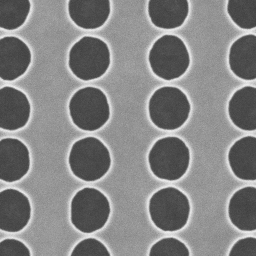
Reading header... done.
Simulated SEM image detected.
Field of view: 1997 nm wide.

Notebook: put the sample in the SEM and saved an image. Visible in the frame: a regular array of holes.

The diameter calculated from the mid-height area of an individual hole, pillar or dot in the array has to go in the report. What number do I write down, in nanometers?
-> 331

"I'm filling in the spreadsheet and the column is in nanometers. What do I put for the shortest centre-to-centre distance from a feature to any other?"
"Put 394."